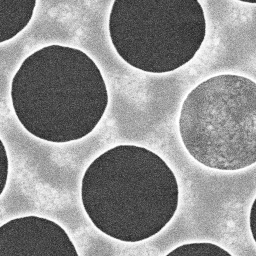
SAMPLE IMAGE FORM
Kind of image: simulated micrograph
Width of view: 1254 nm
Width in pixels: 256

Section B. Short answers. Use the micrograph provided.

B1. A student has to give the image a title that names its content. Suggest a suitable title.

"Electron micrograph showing holes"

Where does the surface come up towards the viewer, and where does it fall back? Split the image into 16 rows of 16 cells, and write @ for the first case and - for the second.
--@@@@@------@@@
--@@@@@------@@@
@@@@@@@------@@@
@@---@@@----@@@@
@-----@@@-@@@@@@
@------@@@@@----
@------@@@@-----
@-----@@@@@-----
@@---@@@@@@-----
@@@@@@@---@@----
-@@@@------@@--@
@@@@@------@@@@@
@@@@@------@@@@@
@@@@@@-----@@@@@
----@@----@@@@@@
-----@@@@@@---@@